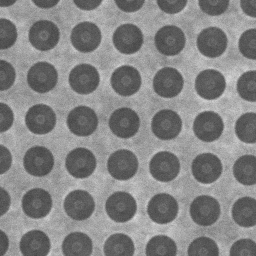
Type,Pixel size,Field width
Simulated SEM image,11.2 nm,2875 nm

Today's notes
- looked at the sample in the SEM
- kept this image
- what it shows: an array of small figures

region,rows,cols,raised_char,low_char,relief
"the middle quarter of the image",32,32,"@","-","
@@@----@@@@@@@---@@@@@@@@@@@@@@@
@@------@@@@@------@@@@@-----@@@
@--------@@@-------@@@@------@@@
@---@@---@@@---@---@@@--------@@
@---@@---@@----@@---@@---@@---@@
@--------@@@-------@@@----@---@@
@@------@@@@-------@@@--------@@
@@@@--@@@@@@@-----@@@@@------@@@
@@@@@@@@@@@@@@@@@@@@@@@@@--@@@@@
@@@@@@@@@@@@@@@@@@@@@@@@@@@@@@@@
@@@---@@@@@@@@@@@@@@@@@@@@@@@@@@
@@-----@@@@@@-----@@@@@@---@@@@@
@-------@@@@------@@@@@------@@@
@---@----@@--------@@@-------@@@
----@@---@@---@@---@@@---@----@@
@--------@@---@@---@@@---@@---@@
@-------@@@--------@@@-------@@@
@@-----@@@@@------@@@@-------@@@
@@@@@@@@@@@@@@---@@@@@@-----@@@@
@@@@@@@@@@@@@@@@@@@@@@@@@@@@@@@@
@@@@@@@@@@@@@@@@@@@@@@@@@@@@@@@@
@@-----@@@@@@---@@@@@@@@@@@@@@@@
@------@@@@@------@@@@------@@@@
--------@@@-------@@@@-------@@@
---@@---@@@---@----@@--------@@@
----@---@@@---@@---@@---@@---@@@
@-------@@@--------@@---@@---@@@
@------@@@@-------@@@@-------@@@
@@@---@@@@@@-----@@@@@------@@@@
@@@@@@@@@@@@@@@@@@@@@@@@--@@@@@@
@@@@@@@@@@@@@@@@@@@@@@@@@@@@@@@@
@@---@@@@@@@@@@@@@@@@@@@@@@@@@@@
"